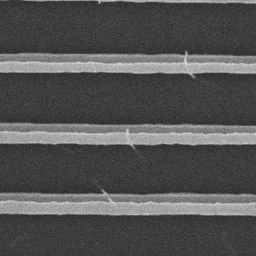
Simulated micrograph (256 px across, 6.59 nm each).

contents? lines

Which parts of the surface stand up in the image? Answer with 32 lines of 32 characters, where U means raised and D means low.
DDDDDDDDDDDDDDDDDDDDDDDDDDDDDDDD
DDDDDDDDDDDDDDDDDDDDDDDDDDDDDDDD
DDDDDDDDDDDDDDDDDDDDDDDDDDDDDDDD
DDDDDDDDDDDDDDDDDDDDDDDDDDDDDDDD
DDDDDDDDDDDDDDDDDDDDDDDDDDDDDDDD
DDDDDDDDDDDDDDDDDDDDDDDDDDDDDDDD
DDDDDDDDDDDDDDDDDDDDDDDDDDDDDDDD
UUUUUUUUUUUUUUUUUUUUUUUUUUUUUUUU
UUUUUUUUUUUUUUUUUUUUUUUUUUUUUUUU
DDDDDDDDDDDDDDDDDDDDDDDDDDDDDDDD
DDDDDDDDDDDDDDDDDDDDDDDDDDDDDDDD
DDDDDDDDDDDDDDDDDDDDDDDDDDDDDDDD
DDDDDDDDDDDDDDDDDDDDDDDDDDDDDDDD
DDDDDDDDDDDDDDDDDDDDDDDDDDDDDDDD
DDDDDDDDDDDDDDDDDDDDDDDDDDDDDDDD
DDDDDDDDDDDDDDDDDDDDDDDDDDDDDDDD
UUUUUUUUUUUUUUUUUUUUUUUUUUUUUUUU
UUUUUUUUUUUUUUUUUUUUUUUUUUUUUUUU
DDDDDDDDDDDDDDDDDDDDDDDDDDDDDDDD
DDDDDDDDDDDDDDDDDDDDDDDDDDDDDDDD
DDDDDDDDDDDDDDDDDDDDDDDDDDDDDDDD
DDDDDDDDDDDDDDDDDDDDDDDDDDDDDDDD
DDDDDDDDDDDDDDDDDDDDDDDDDDDDDDDD
DDDDDDDDDDDDDDDDDDDDDDDDDDDDDDDD
UUUUUUUUUUUUUUUUUUUUUUUUUUUUUDUU
UUUUUUUUUUUUUUUUUUUUUUUUUUUUUUUU
UUUUUUUUUUUUUUUUUUUUUUUUUUUUUUUU
DDDDDDDDDDDDDDDDDDDDDDDDDDDDDDDD
DDDDDDDDDDDDDDDDDDDDDDDDDDDDDDDD
DDDDDDDDDDDDDDDDDDDDDDDDDDDDDDDD
DDDDDDDDDDDDDDDDDDDDDDDDDDDDDDDD
DDDDDDDDDDDDDDDDDDDDDDDDDDDDDDDD